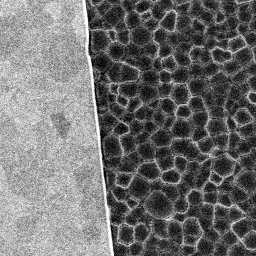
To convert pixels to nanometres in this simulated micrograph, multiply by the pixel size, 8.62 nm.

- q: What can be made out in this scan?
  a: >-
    one or a few lines or trenches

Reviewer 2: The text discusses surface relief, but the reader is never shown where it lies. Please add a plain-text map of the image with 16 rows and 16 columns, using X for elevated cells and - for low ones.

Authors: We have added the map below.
XXXXX-----------
XXXXX-----------
XXXXXX----------
XXXXXX----------
XXXXXX----------
XXXXXX----------
XXXXXX----------
XXXXXX----------
XXXXXX----------
XXXXXX----------
XXXXXX----------
XXXXXXX---------
XXXXXXX--X------
XXXXXXX---------
XXXXXXX---------
XXXXXXX---------